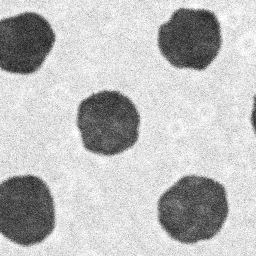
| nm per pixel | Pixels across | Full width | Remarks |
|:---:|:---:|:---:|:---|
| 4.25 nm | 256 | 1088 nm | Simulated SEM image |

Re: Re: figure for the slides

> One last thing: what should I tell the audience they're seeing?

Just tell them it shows holes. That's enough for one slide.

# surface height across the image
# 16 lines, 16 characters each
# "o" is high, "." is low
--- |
oooooooooooooooo
...ooooooo....oo
...ooooooo....oo
...ooooooo....oo
..oooooooooooooo
oooooooooooooooo
ooooo...oooooooo
ooooo....ooooooo
ooooo....ooooooo
oooooo..oooooooo
oooooooooooooooo
...oooooooo...oo
...ooooooo....oo
...ooooooo....oo
...ooooooo....oo
oooooooooooooooo